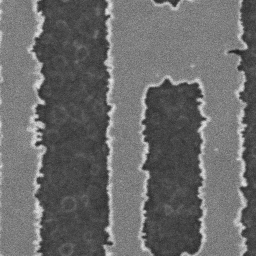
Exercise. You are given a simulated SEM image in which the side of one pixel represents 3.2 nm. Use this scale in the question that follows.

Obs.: one or a few lines or trenches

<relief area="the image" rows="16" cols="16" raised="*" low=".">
**.....********.
***....********.
**.....********.
**.....********.
***....********.
**.....**....**.
**.....**....**.
**.....**....**.
**.....**....**.
***....**....**.
**.....**....**.
**.....**....**.
**.....**....**.
***....**....**.
**.....**....**.
**.....**....**.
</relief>